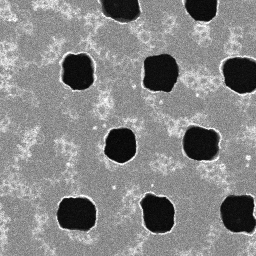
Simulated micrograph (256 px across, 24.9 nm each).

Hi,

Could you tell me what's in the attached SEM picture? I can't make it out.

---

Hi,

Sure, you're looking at holes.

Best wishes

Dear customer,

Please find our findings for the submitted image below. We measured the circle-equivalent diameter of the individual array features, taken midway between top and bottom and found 0.896 um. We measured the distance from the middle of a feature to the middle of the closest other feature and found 2010 nanometers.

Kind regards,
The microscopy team